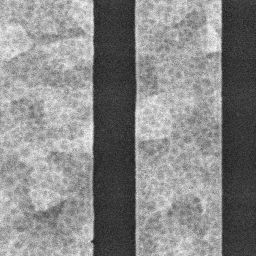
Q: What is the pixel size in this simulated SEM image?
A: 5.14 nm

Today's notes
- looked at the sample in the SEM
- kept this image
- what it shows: one or a few lines or trenches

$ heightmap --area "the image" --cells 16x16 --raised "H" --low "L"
HHHHHHLLLHHHHHLL
HHHHHHLLLHHHHHLL
HHHHHHLLLHHHHHLL
HHHHHHLLLHHHHHLL
HHHHHHLLLHHHHHLL
HHHHHHLLLHHHHHLL
HHHHHHLLLHHHHHLL
HHHHHHLLLHHHHHLL
HHHHHHLLLHHHHHLL
HHHHHHLLLHHHHHLL
HHHHHHLLLHHHHHLL
HHHHHHLLLHHHHHLL
HHHHHHLLLHHHHHLL
HHHHHHLLLHHHHHLL
HHHHHHLLLHHHHHLL
HHHHHHLLLHHHHHLL